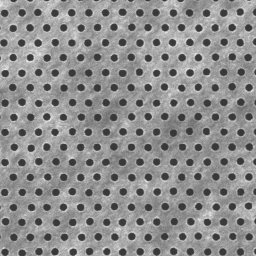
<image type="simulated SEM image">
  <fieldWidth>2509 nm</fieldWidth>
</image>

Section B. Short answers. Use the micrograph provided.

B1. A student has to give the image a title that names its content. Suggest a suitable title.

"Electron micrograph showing a regular array of holes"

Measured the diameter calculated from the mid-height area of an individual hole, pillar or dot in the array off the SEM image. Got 0.0742 um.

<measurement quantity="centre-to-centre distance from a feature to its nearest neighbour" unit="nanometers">161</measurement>